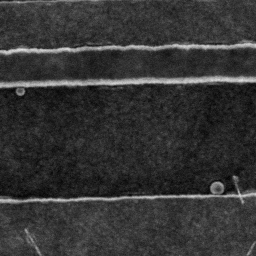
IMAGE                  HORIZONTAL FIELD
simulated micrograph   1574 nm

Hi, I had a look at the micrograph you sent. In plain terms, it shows lines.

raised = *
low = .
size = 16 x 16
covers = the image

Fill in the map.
****************
****************
****************
****************
****************
................
................
................
................
................
................
................
.....***********
****************
****************
****************